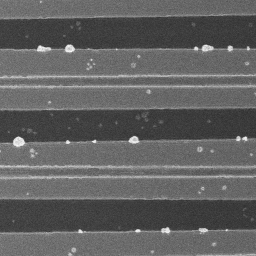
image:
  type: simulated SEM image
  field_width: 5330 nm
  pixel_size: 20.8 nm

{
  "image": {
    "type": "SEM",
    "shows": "lines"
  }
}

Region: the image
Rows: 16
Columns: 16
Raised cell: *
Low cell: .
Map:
****************
................
................
****************
****************
****************
****************
................
................
****************
****************
****************
................
................
....************
****************